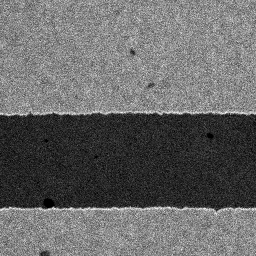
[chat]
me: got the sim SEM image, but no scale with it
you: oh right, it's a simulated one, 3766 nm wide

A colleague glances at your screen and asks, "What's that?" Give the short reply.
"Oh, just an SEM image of one or a few lines or trenches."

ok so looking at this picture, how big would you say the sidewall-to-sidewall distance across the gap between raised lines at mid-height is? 1.41 micrometres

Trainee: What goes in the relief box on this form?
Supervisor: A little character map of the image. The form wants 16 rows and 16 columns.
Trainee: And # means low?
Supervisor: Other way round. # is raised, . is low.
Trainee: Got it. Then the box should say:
################
################
################
################
################
################
################
................
................
................
................
................
................
################
################
################